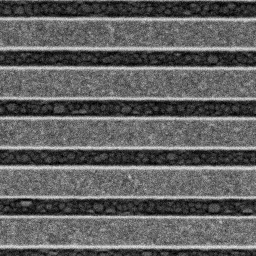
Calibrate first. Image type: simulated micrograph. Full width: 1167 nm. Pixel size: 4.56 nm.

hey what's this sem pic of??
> parallel lines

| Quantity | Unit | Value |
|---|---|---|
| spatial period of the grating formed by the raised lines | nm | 226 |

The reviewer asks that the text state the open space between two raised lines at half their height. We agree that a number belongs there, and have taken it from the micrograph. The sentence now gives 82.7 nm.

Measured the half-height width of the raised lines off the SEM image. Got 141 nm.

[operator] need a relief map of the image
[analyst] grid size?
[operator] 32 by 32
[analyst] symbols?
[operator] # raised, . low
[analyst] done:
................................
................................
################################
################################
################################
################################
................................
................................
############....................
################################
################################
################################
................................
................................
................................
################################
################################
################################
.......#..##.....#...###########
................................
................................
################################
################################
################################
################################
................................
................................
################################
################################
################################
################################
................................